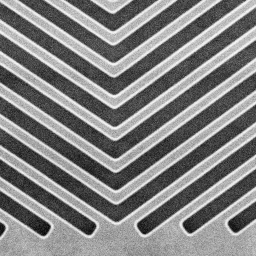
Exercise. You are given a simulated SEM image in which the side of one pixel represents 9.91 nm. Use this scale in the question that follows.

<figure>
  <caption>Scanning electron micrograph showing groups of lines, slits or small figures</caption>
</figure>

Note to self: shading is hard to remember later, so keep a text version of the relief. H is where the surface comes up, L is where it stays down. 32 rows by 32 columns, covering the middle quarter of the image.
HLLLLLLLHHHHHHHHHLLLLLLHHHHLLLLL
HHLLLLLLLLHHHHHLLLLLLLHHHHLLLLLL
HHHHLLLLLLLHHHLLLLLLLHHHHLLLLLLL
LHHHHLLLLLLLLLLLLLLHHHHLLLLLLLHH
LLHHHHHLLLLLLLLLLLHHHHLLLLLLLHHH
LLLLHHHHLLLLLLLLHHHHHLLLLLLLHHHH
LLLLLHHHHHLLLLLHHHHLLLLLLLHHHHLL
LLLLLLLHHHHLLLHHHHLLLLLLLHHHHLLL
HLLLLLLLHHHHHHHHHLLLLLLHHHHHLLLL
HHLLLLLLLLHHHHHLLLLLLLHHHHLLLLLL
HHHHLLLLLLLHHHLLLLLLLHHHHLLLLLLL
LHHHHHLLLLLLLLLLLLLHHHHHLLLLLLHH
LLLHHHHLLLLLLLLLLLHHHHLLLLLLLHHH
LLLLHHHHLLLLLLLLLHHHHLLLLLLLHHHH
LLLLLLHHHHLLLLLHHHHLLLLLLLHHHHLL
LLLLLLLHHHHHLLHHHHLLLLLLLHHHHLLL
HLLLLLLLLHHHHHHHHLLLLLLLHHHHLLLL
HHHLLLLLLLHHHHHLLLLLLLHHHHLLLLLL
HHHHLLLLLLLLHHLLLLLLLHHHHLLLLLLL
LHHHHHLLLLLLLLLLLLLHHHHHLLLLLLHH
LLLHHHHLLLLLLLLLLLHHHHLLLLLLLHHH
LLLLHHHHHLLLLLLLLHHHHLLLLLLLHHHH
LLLLLLHHHHLLLLLHHHHLLLLLLLHHHHHL
LLLLLLLHHHHHLLHHHHLLLLLLLHHHHLLL
HHLLLLLLLHHHHHHHHLLLLLLLHHHHLLLL
HHHLLLLLLLHHHHHLLLLLLLHHHHLLLLLL
HHHHHLLLLLLLHHLLLLLLLHHHHLLLLLLL
LLHHHHLLLLLLLLLLLLLHHHHHLLLLLLLH
LLLHHHHHLLLLLLLLLLHHHHLLLLLLLHHH
LLLLLHHHHLLLLLLLLHHHHLLLLLLLHHHH
LLLLLLHHHHHLLLLHHHHHLLLLLLHHHHHL
LLLLLLLHHHHHLLHHHHLLLLLLLHHHHLLL